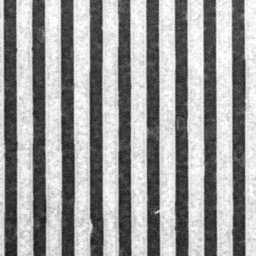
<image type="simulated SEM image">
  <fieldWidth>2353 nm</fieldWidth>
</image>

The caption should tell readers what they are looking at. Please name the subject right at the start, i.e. parallel lines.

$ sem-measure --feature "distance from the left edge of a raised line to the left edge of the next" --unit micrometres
0.262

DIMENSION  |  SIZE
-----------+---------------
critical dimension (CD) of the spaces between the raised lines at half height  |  128 nanometres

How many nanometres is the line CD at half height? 134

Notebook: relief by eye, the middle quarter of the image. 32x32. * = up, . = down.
...***....***....***....***....*
...***....***....***....***....*
...***....***....***....***....*
...***....***....***....***....*
...***....***....***....***....*
...***....***....***....***....*
...***....***....***....***....*
...***....***....***....***....*
...***....***....***....***....*
...***....***....***....***....*
...***....***....***....***....*
...***....***....***....***....*
...***....***....***....***....*
...***....***....***....***....*
...***....***....***....***.**.*
...***....***....***....***.**.*
...***....***....***....***....*
...***....***....***....***....*
...***....***....***....***....*
...***....***....***....***....*
...***....***....***....***....*
...***....***....***....***....*
...***....***....***....***....*
...***....***....***....***....*
...***....***....***....***....*
...***....***....***....***....*
...***....***....***....***....*
...***....***....***....***....*
...***....***....***....***....*
...***....***....***....***....*
...***....***....***....***....*
...***....***....***....***....*